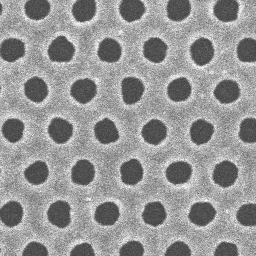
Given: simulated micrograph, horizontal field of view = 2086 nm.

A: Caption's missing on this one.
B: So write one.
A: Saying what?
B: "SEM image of a regular array of holes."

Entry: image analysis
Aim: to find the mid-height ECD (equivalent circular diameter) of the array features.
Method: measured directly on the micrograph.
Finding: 207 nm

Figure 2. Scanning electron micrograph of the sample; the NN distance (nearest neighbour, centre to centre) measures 0.376 microns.